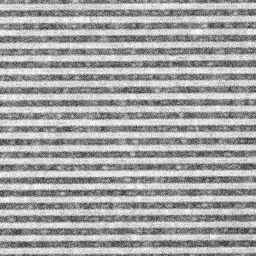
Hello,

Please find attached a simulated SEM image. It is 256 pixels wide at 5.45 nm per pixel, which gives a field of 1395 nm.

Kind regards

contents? parallel lines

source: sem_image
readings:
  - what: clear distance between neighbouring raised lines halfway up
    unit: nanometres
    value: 46.4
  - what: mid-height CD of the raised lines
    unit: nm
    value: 23.9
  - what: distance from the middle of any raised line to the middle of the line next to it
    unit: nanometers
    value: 70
